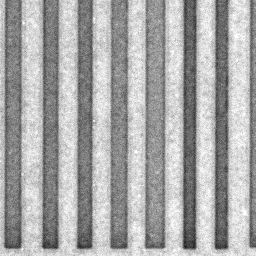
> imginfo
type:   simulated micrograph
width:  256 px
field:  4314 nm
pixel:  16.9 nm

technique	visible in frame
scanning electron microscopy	parallel lines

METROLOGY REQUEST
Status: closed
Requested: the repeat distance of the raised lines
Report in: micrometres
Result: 0.58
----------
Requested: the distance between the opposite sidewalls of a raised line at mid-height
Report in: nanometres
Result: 291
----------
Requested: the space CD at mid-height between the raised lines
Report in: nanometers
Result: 291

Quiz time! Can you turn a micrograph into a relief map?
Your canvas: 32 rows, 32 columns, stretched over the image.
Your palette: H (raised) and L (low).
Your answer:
LLLHHLLLHHLLHHLLHHLLLHHLLHHLLHHL
LLLHHLLLHHLLHHLLHHLLLHHLLHHLLHHL
LLLHHLLLHHLLHHLLHHLLLHHLLHHLLHHL
LLLHHLLLHHLLHHLLHHLLLHHLLHHLLHHL
LLLHHLLLHHLLHHLLHHLLLHHLLHHLLHHL
LLLHHLLLHHLLHHLLHHLLLHHLLHHLLHHL
LLLHHLLLHHLLHHLLHHLLLHHLLHHLLHHL
LLLHHLLHHHLLHHLLHHLLLHHLLHHLLHHL
LLLHHLLHHHLLHHLLHHLLLHHLLHHLLHHL
LLLHHLLLHHLLHHLLHHLLLHHLLHHLLHHL
LLLHHLLLHHLLHHLLHHLLLHHLLHHLLHHL
LLLHHLLLHHLLHHLLHHLLLHHLLHHLLHHL
LLLHHLLLHHLLHHLLHHLLLHHLLHHLLHHL
LLLHHLLLHHLLHHLLHHLLLHHLLHHLLHHL
LLLHHLLHHHLLHHLLHHLLLHHLLHHLLHHL
LLLHHLLLHHLLHHLLHHLLLHHLLHHLLHHL
LLLHHLLHHHLLHHLLHHLLLHHLLHHLLHHL
LLLHHLLHHHLLHHLLHHLLLHHLLHHLLHHL
LLLHHLLLHHLLHHLLHHLLLHHLLHHLLHHL
LLLHHLLHHHLLHHLLHHLLLHHLLHHLLHHL
LLLHHLLHHHLLHHLLHHLLLHHLLHHLLHHL
LLLHHLLHHHLLHHLLHHLLLHHLLHHLLHHL
LLLHHLLHHHLLHHLLHHLLLHHLLHHLLHHL
LLLHHLLHHHLLHHLLHHLLLHHLLHHLLHHL
LLLHHLLHHHLLHHLLHHLLLHHLLHHLLHHL
LLLHHLLHHHLLHHLLHHLLLHHLLHHLLHHL
LLLHHLLHHHLLHHLLHHLLLHHLLHHLLHHL
LLLHHLLHHHLLHHLLHHLLLHHLLHHLLHHL
LLLHHLLHHHLLHHLLHHLLLHHLLHHLLHHL
LLLHHLLHHHLLHHLLHHLLLHHLLHHLLHHL
LLLHHLLHHHLLHHLLHHLLLHHLLHHLLHHL
HHHHHHHHHHHHHHHHHHHHHHHHHHHHHHHH